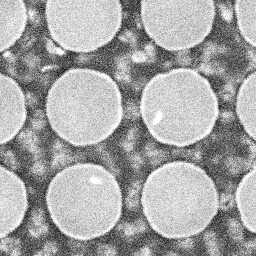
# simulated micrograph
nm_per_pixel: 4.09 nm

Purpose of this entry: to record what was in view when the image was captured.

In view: raised bodies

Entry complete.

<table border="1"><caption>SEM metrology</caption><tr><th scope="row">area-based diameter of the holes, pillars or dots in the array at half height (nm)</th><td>307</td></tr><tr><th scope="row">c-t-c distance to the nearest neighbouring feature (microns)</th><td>0.383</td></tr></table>